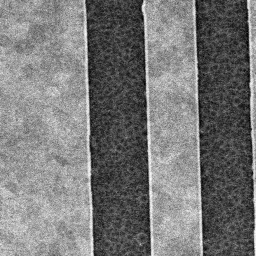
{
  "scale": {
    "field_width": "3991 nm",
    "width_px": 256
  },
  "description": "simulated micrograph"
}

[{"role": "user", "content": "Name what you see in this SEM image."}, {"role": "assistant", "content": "one or a few lines or trenches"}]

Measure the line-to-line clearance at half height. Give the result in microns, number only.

0.921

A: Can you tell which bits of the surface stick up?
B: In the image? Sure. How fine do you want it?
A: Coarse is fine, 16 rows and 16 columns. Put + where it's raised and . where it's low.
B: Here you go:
+++++....+++....
+++++....+++....
+++++....+++....
+++++....+++....
+++++....+++....
+++++....+++....
+++++....+++....
++++++...+++....
++++++...+++....
++++++...+++....
++++++...+++....
++++++...+++....
++++++...+++....
++++++...++++...
++++++...++++...
++++++....+++...